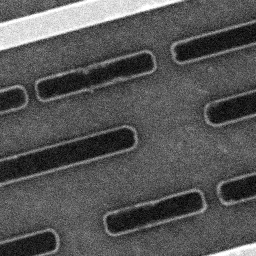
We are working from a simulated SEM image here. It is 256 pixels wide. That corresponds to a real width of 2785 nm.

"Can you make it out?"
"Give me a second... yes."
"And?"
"one or a few lines or trenches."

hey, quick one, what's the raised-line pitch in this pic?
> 754 nanometres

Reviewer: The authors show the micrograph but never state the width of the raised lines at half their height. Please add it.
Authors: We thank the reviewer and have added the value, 253 nm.